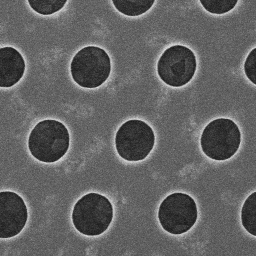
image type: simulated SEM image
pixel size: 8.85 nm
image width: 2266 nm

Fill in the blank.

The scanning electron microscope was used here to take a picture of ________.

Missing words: holes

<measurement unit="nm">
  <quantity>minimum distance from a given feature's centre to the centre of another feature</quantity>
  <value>750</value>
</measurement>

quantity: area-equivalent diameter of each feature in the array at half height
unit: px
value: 40.9